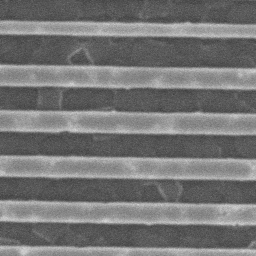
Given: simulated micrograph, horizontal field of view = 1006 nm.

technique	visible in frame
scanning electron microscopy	parallel lines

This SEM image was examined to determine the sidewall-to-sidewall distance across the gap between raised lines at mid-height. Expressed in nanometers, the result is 96.7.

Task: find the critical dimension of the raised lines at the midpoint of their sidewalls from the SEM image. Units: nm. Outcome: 80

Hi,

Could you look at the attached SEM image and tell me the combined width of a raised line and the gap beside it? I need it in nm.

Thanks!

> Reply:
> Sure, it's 180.